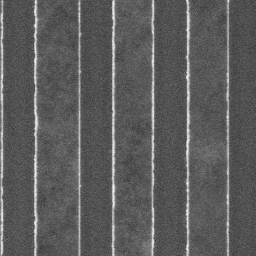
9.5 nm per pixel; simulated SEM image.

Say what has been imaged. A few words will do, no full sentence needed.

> lines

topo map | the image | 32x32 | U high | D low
DDDDUUUUUUDDDDUUUUUDDDDUUUUUDDDD
DDDDUUUUUUDDDDUUUUUDDDDUUUUUDDDD
DDDDUUUUUUDDDDUUUUUDDDDUUUUUDDDD
DDDDUUUUUUDDDDUUUUUDDDDUUUUUDDDD
DDDDUUUUUUDDDDUUUUUDDDDUUUUUDDDD
DDDDUUUUUUDDDDUUUUUDDDDUUUUUDDDD
DDDDUUUUUUDDDDUUUUUDDDDUUUUUDDDD
DDDDUUUUUUDDDDUUUUUDDDDUUUUUDDDD
DDDDUUUUUUDDDDUUUUUDDDDUUUUUDDDD
DDDDUUUUUUDDDDUUUUUDDDDUUUUUDDDD
DDDDUUUUUUDDDDUUUUUDDDDUUUUUDDDD
DDDDUUUUUUDDDDUUUUUDDDDUUUUUDDDD
DDDDUUUUUUDDDDUUUUUDDDDUUUUUDDDD
DDDDUUUUUUDDDDUUUUUDDDDUUUUUDDDD
DDDDUUUUUUDDDDUUUUUDDDDUUUUUDDDD
DDDDUUUUUUDDDDUUUUUDDDDUUUUUDDDD
DDDDUUUUUUDDDDUUUUUDDDDUUUUUDDDD
DDDDUUUUUUDDDDUUUUUDDDDUUUUUDDDD
DDDDUUUUUUDDDDUUUUUDDDDUUUUUDDDD
DDDDUUUUUUDDDDUUUUUDDDDUUUUUDDDD
DDDDUUUUUUDDDDUUUUUDDDDUUUUUDDDD
DDDDUUUUUUDDDDUUUUUDDDDUUUUUDDDD
DDDDUUUUUUDDDDUUUUUDDDDUUUUUDDDD
DDDDUUUUUUDDDDUUUUUDDDDUUUUUDDDD
DDDDUUUUUUDDDDUUUUUDDDDUUUUUDDDD
DDDDUUUUUUDDDDUUUUUDDDDUUUUUDDDD
DDDDUUUUUUDDDDUUUUUDDDDUUUUUDDDD
DDDDUUUUUUDDDDUUUUUDDDDUUUUUDDDD
DDDDUUUUUUDDDDUUUUUDDDDUUUUUDDDD
DDDDUUUUUUDDDDUUUUUDDDDUUUUUDDDD
DDDDUUUUUUDDDDUUUUUDDDDUUUUUDDDD
DDDDUUUUUUDDDDUUUUUDDDDUUUUUDDDD